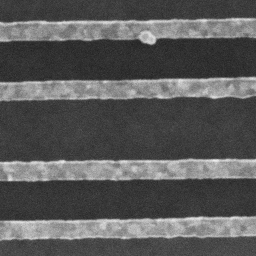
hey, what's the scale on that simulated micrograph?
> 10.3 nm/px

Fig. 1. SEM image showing lines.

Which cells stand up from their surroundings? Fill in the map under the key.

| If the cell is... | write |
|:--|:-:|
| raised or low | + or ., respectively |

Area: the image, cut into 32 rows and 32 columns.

................................
................................
.....................++.++++++++
++++++++++++++++++++++++++++++++
++++++++++++++++++++++++++++++++
................................
................................
................................
................................
................................
++++++++++++++++++++++++++++++++
++++++++++++++++++++++++++++++++
++..............................
................................
................................
................................
................................
................................
................................
................................
++++++++++++++++++++++++++++++++
++++++++++++++++++++++++++++++++
+++++++.......+.................
................................
................................
................................
................................
............+++.++++++++++++++++
++++++++++++++++++++++++++++++++
++++++++++++++++++++++++++++++..
................................
................................